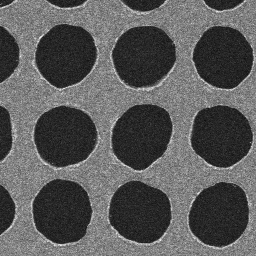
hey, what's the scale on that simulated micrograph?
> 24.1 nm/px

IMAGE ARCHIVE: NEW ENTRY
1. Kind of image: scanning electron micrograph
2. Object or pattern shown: a regular array of holes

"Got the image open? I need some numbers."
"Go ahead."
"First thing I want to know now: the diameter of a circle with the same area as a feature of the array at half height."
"1.51 micrometres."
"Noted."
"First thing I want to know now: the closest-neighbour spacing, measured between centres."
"1880 nanometres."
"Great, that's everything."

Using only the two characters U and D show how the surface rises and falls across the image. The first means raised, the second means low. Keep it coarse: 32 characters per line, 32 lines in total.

DUUUUUDDDDUUUUUUDDDDUUUUUUDDDDUU
UUUUUUUUUUUUUUUUUUUUUUUUUUUUUUUU
UUUUUUUUUUUUUUUUUUUUUUUUUUUUUUUU
UUUUUUDDDDUUUUUUDDDDUUUUUUDDDUUU
DDUUUDDDDDDUUUUDDDDDDUUUUDDDDDUU
DDUUUDDDDDDDUUDDDDDDDDUUDDDDDDDU
DDUUDDDDDDDDUUDDDDDDDDUUDDDDDDDD
DDUUDDDDDDDDUUDDDDDDDDUUDDDDDDDD
DDUUUDDDDDDDUUDDDDDDDDUUDDDDDDDD
DUUUUDDDDDDUUUUDDDDDDUUUUDDDDDDU
UUUUUUDDDUUUUUUUDDDDUUUUUUDDDDUU
UUUUUUUUUUUUUUUUUUUUUUUUUUUUUUUU
UUUUUUUUUUUUUUUUUUUUUUUUUUUUUUUU
DUUUUUUDDUUUUUUUDDDDUUUUUDDDDUUU
DUUUUDDDDDDUUUUDDDDDDUUUDDDDDDUU
DUUUDDDDDDDDUUDDDDDDDDUUDDDDDDDU
DDUUDDDDDDDDUUDDDDDDDDUUDDDDDDDD
DDUUDDDDDDDDUUDDDDDDDUUUDDDDDDDD
DUUUUDDDDDDDUUDDDDDDDUUUDDDDDDDU
DUUUUDDDDDDUUUDDDDDDUUUUUDDDDDDU
UUUUUUDDDUUUUUUUDDDUUUUUUUDDDUUU
UUUUUUUUUUUUUUUUUUUUUUUUUUUUUUUU
UUUUUUUDUUUUUUUUUUUUUUUUUUUUUUUU
DUUUUDDDDDUUUUUDDDDUUUUUUUDDDDUU
DUUUUDDDDDDUUUDDDDDDDUUUUDDDDDDU
DDUUDDDDDDDUUUDDDDDDDUUUDDDDDDDU
DDUUDDDDDDDDUUDDDDDDDUUUDDDDDDDU
DDUUDDDDDDDUUUDDDDDDDUUUDDDDDDDU
DUUUUDDDDDDUUUDDDDDDDUUUDDDDDDDU
UUUUUUDDDDDUUUUDDDDDUUUUDDDDDDUU
UUUUUUUUUUUUUUUUUUUUUUUUUUDDDUUU
UUUUUUUUUUUUUUUUUUUUUUUUUUUUUUUU